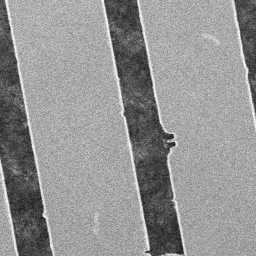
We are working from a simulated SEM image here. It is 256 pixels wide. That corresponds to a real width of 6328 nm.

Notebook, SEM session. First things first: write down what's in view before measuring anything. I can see one or a few lines or trenches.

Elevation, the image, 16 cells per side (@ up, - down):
@@@@@@---@@@@@@-
-@@@@@@--@@@@@@-
-@@@@@@--@@@@@@-
-@@@@@@--@@@@@@-
-@@@@@@--@@@@@@-
-@@@@@@---@@@@@@
--@@@@@@--@@@@@@
--@@@@@@--@@@@@@
--@@@@@@---@@@@@
--@@@@@@---@@@@@
--@@@@@@---@@@@@
---@@@@@@--@@@@@
---@@@@@@--@@@@@
@--@@@@@@--@@@@@
@--@@@@@@--@@@@@
@--@@@@@@---@@@@